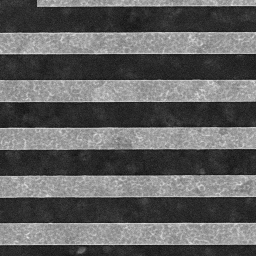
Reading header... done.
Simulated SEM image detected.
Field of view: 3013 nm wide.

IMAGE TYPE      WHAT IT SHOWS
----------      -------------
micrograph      parallel lines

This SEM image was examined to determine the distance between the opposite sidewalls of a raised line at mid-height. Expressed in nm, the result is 255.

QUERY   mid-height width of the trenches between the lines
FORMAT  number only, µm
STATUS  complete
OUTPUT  0.309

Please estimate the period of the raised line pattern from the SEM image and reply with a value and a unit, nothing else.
0.561 micrometres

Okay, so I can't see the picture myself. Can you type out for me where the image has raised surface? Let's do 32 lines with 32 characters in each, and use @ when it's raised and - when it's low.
-----@@@@@@@@@@@@@@@@@@@@@@@@@@@
--------------------------------
--------------------------------
--------------------------------
@@@@@@@@@@@@@@@@@@@@@@@@@@@@@@@@
@@@@@@@@@@@@@@@@@@@@@@@@@@@@@@@@
@@@@@@@@@@@@@@@@@@@@@@@@@@@@@@@@
--------------------------------
--------------------------------
--------------------------------
@@@@@@@@@@@@@@@@@@@@@@@@@@@@@@@@
@@@@@@@@@@@@@@@@@@@@@@@@@@@@@@@@
@@@@@@@@@@@@@@@@@@@@@@@@@@@@@@@@
--------------------------------
--------------------------------
--------------------------------
@@@@@@@@@@@@@@@@@@@@@@@@@@@@@@@@
@@@@@@@@@@@@@@@@@@@@@@@@@@@@@@@@
@@@@@@@@@@@@@@@@@@@@@@@@@@@@@@@@
--------------------------------
--------------------------------
--------------------------------
@@@@@@@@@@@@@@@@@@@@@@@@@@@@@@@@
@@@@@@@@@@@@@@@@@@@@@@@@@@@@@@@@
@@@@@@@@@@@@@@@@@@@@@@@@@@@@@@@@
--------------------------------
--------------------------------
--------------------------------
@@@@@@@@@@@@@@@@@@@@@@@@@@@@@@@@
@@@@@@@@@@@@@@@@@@@@@@@@@@@@@@@@
@@@@@@@@@@@@@@@@@@@@@@@@@@@@@@@@
--------------------------------